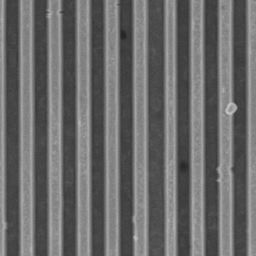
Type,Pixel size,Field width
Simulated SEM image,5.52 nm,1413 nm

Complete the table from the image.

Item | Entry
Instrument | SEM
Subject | parallel lines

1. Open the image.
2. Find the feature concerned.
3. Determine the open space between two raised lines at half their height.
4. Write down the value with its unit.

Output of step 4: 78.6 nanometres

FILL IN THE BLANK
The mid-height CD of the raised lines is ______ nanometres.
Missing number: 78.6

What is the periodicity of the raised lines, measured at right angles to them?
0.157 microns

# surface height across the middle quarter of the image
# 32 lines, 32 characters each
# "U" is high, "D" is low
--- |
DDDUUUDDDDUUUUDDDUUUUDDDDUUUDDDD
DDDUUUDDDDUUUUDDDUUUUDDDDUUUDDDD
DDDUUUDDDDUUUUDDDUUUUDDDDUUUDDDD
DDDUUUDDDDUUUUDDDUUUUDDDDUUUDDDD
DDDUUUDDDDUUUUDDDUUUUDDDDUUUDDDD
DDDUUUDDDDUUUUDDDUUUUDDDDUUUDDDD
DDDUUUDDDDUUUUDDDUUUUDDDDUUUDDDD
DDDUUUDDDDUUUUDDDUUUUDDDDUUUDDDD
DDDUUUDDDDUUUUDDDUUUUDDDDUUUDDDD
DDDUUUDDDDUUUUDDDUUUUDDDDUUUDDDD
DDDUUUDDDDUUUUDDDUUUUDDDDUUUDDDD
DDDUUUDDDDUUUUDDDUUUUDDDDUUUDDDD
DDDUUUDDDDUUUUDDDUUUUDDDDUUUDDDD
DDDUUUDDDDUUUUDDDUUUUDDDDUUUDDDD
DDDUUUDDDDUUUUDDDUUUUDDDDUUUDDDD
DDDUUUUDDDUUUUDDDUUUUDDDDUUUDDDD
DDDUUUUDDDUUUUDDDUUUUDDDDUUUDDDD
DDDUUUUDDDUUUUDDDUUUUDDDDUUUDDDD
DDDUUUUDDDUUUUDDDUUUUDDDDUUUDDDD
DDDUUUUDDDUUUUDDDUUUUDDDDUUUDDDD
DDDUUUUDDDUUUUDDDUUUUDDDDUUUDDDD
DDDUUUUDDDUUUUDDDUUUUDDDDUUUDDDD
DDDUUUUDDDUUUUDDDUUUUDDDDUUUDDDD
DDDUUUUDDDUUUUDDDUUUUDDDDUUUDDDD
DDDUUUUDDDUUUUDDDUUUUDDDDUUUDDDD
DDDUUUUDDDUUUUDDDUUUUDDDDUUUDDDD
DDDUUUUDDDUUUUDDDUUUUDDDDUUUDDDD
DDDUUUUDDDUUUUDDDUUUUDDDDUUUDDDD
DDDUUUUDDDUUUUDDDUUUUDDDDUUUDDDD
DDDUUUUDDDUUUUDDDUUUUDDDDUUUDDDD
DDDUUUUDDDUUUUDDDUUUUDDDDUUUDDDD
DDDUUUUDDDUUUUDDDUUUUDDDDUUUDDDD